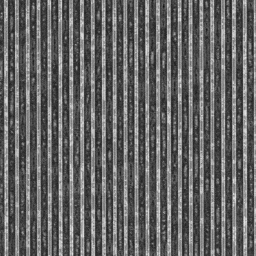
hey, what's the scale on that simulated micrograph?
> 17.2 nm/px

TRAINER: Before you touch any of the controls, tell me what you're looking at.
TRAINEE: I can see parallel lines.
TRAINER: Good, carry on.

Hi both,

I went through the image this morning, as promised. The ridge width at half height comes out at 47.4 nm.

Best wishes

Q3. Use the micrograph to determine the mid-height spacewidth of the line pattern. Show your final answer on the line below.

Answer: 138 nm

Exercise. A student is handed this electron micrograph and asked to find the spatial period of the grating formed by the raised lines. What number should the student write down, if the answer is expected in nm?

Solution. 187